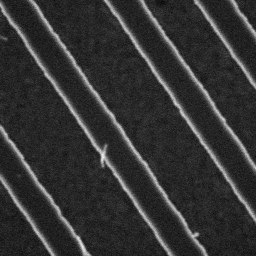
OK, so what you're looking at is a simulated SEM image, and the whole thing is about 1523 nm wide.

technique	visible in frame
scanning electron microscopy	lines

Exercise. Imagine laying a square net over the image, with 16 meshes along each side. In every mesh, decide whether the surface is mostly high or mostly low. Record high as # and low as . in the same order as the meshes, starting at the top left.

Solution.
##.....##...###.
.##.....##...###
.###....###...##
..##.....##....#
...##.....##...#
...###....###...
....###....##...
.....##.....##..
.....###....###.
#.....###....##.
##.....##.....##
###.....##....##
.##.....###....#
..##.....##.....
..###.....##....
...##.....###...